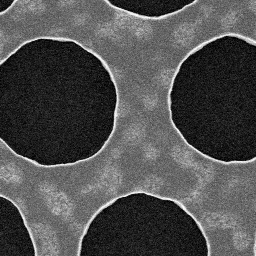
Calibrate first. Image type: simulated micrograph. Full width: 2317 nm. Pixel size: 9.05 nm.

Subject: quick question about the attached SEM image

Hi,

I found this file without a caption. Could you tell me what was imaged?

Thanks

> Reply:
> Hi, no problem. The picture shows holes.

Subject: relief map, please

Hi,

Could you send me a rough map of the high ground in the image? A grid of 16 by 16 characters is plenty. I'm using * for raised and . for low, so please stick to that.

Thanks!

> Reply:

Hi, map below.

*******....*****
****************
**..*********..*
*.....******....
.......****.....
.......****.....
.......****.....
.......****.....
.......****.....
*.....*******...
****************
****************
*******...******
.*****......****
..***........***
..***........***